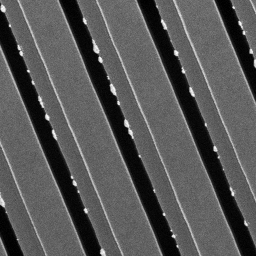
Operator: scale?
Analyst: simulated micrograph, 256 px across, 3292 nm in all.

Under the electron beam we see lines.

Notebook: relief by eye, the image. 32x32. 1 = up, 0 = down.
11111111001111111000111111100111
11111111001111111100111111100111
01111111001111111100111111110011
01111111100111111110011111110011
00111111100111111110011111111001
00111111110011111110011111111001
00111111110011111111001111111001
10011111110011111111001111111100
10011111111001111111100111111100
11001111111001111111100111111110
11001111111100111111100011111110
11000111111100111111110011111110
11100111111100011111110011111111
11100111111110011111111001111111
11110011111110011111111001111111
11110011111111001111111000111111
11110001111111001111111100111111
11111001111111000111111100111111
11111001111111100111111110011111
11111100111111100111111110011111
11111100111111110011111110001111
11111110011111110011111111001111
11111110011111111001111111001111
11111110001111111001111111100111
11111111001111111000111111100111
11111111001111111100111111100011
01111111100111111100111111110011
01111111100111111110011111110011
00111111100011111110011111111001
00111111110011111110001111111001
00111111110011111111001111111100
10011111111001111111001111111100